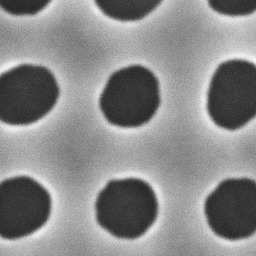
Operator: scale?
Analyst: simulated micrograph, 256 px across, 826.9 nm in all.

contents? holes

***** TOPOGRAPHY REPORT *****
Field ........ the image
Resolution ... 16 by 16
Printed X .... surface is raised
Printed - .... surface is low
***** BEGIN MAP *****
---XXX----XXX---
XXXXXXXXXXXXXXXX
XXXXXXXXXXXXXXXX
XXXXXXXXXXXXXXXX
---XXXX---XXX---
----XX----XXX---
---XXX----XXX---
---XXXX--XXXX---
XXXXXXXXXXXXXXXX
XXXXXXXXXXXXXXXX
XXXXXXXXXXXXXXXX
---XXXX--XXXXX--
---XXX----XXX---
---XXX----XXX---
--XXXXX--XXXX---
XXXXXXXXXXXXXXXX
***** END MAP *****